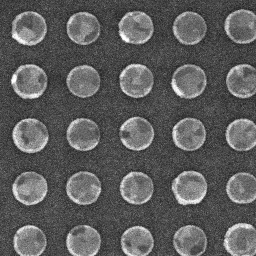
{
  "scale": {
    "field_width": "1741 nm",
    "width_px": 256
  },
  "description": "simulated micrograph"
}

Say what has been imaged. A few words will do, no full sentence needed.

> a regular array of raised bodies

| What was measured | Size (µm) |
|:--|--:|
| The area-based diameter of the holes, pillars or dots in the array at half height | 0.228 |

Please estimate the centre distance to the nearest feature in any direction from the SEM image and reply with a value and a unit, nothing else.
359 nanometers